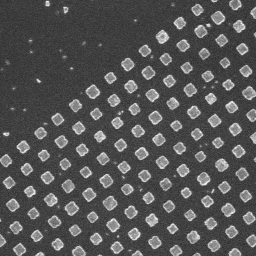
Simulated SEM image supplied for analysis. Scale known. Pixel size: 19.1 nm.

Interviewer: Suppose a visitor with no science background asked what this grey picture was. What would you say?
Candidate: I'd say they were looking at a regular array of raised bodies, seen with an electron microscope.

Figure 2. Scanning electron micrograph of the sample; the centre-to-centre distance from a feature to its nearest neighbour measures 420 nm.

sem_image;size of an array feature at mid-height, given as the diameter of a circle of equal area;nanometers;207